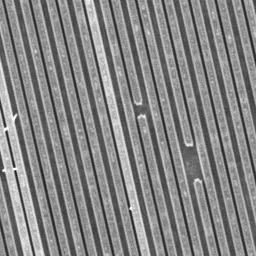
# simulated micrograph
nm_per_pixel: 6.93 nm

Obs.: parallel lines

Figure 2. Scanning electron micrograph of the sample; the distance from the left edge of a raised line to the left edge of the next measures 89.7 nm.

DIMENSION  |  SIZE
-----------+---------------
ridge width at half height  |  55.8 nanometres